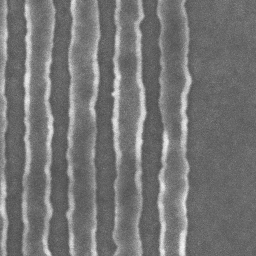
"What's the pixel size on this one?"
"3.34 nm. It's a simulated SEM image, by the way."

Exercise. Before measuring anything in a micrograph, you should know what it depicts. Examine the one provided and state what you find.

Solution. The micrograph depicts parallel lines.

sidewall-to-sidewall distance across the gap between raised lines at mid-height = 18.9 pixels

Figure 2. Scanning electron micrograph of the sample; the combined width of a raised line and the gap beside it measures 151 nm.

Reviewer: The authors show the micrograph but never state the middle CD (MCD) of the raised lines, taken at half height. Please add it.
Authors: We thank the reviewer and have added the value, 0.0873 microns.